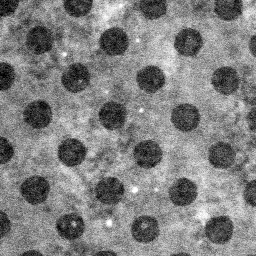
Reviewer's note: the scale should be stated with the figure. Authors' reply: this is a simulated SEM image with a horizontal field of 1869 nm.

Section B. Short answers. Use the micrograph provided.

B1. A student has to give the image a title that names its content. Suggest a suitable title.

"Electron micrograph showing a regular array of raised bodies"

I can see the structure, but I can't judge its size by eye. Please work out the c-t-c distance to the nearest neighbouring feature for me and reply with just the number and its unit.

380 nm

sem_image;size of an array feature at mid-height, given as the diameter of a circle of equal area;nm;225